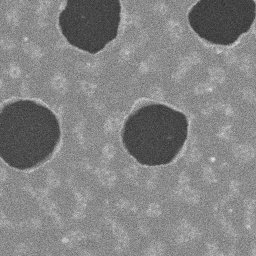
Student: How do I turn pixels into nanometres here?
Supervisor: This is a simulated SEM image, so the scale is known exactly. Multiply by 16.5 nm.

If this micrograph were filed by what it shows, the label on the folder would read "holes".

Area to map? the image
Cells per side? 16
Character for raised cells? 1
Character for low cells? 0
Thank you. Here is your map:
1111000011110000
1111000111110000
1111000111111001
1111111111111111
1111111111111111
1111111111111111
0011111111111111
0000111100001111
0000111100001111
0001111100011111
1011111111111111
1111111111111111
1111111111111111
1111111111111111
1111111111111111
1111111111111111